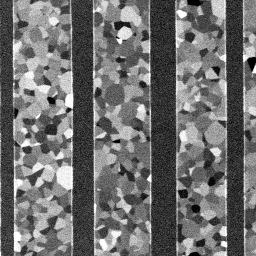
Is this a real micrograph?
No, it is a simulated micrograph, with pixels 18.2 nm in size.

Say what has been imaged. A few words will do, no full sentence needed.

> one or a few lines or trenches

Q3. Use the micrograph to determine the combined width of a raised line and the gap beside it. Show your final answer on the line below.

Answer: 1440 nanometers